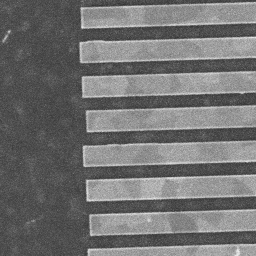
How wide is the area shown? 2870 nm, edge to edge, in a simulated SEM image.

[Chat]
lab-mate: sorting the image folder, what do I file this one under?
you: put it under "parallel lines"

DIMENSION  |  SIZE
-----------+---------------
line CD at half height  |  230 nm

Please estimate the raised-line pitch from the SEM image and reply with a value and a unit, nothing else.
0.388 micrometres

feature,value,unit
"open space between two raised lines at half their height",160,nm